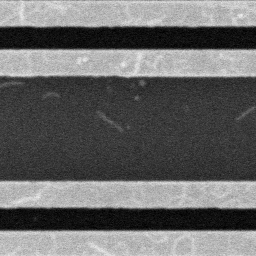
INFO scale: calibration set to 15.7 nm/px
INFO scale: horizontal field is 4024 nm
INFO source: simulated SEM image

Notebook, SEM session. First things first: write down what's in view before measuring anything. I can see lines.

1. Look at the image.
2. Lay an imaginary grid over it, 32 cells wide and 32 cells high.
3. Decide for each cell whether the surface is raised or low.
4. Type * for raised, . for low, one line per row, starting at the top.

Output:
********************************
********************************
********************************
................................
................................
................................
********************************
********************************
********************************
...............**...............
................................
................................
................................
................................
................................
................................
................................
................................
................................
................................
................................
................................
................................
********************************
********************************
********************************
................................
................................
................................
********************************
********************************
********************************